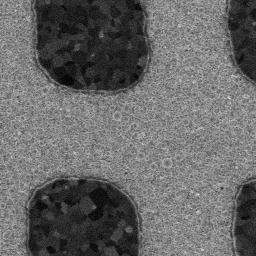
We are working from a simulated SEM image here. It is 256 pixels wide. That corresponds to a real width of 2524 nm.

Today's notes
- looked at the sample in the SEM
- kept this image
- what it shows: raised bodies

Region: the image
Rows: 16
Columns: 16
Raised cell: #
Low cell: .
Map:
..#######.....##
..#######.....##
..#######.....##
..#######......#
...######......#
....####........
................
................
................
................
................
...####........#
..######.......#
..#######......#
..#######......#
..#######......#